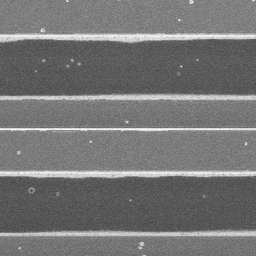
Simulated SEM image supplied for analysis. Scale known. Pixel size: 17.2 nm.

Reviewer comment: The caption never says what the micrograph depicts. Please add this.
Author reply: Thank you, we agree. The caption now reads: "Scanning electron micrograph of lines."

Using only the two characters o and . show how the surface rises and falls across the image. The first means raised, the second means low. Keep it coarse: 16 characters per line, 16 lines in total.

oooooooooooooooo
oooooooooooooooo
................
................
................
................
oooooooooooooooo
oooooooooooooooo
oooooooooooooooo
oooooooooooooooo
oooooooooooooooo
................
................
................
................
oooooooooooooooo